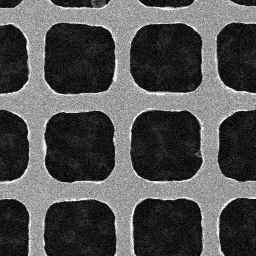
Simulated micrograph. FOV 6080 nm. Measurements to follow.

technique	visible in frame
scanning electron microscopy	holes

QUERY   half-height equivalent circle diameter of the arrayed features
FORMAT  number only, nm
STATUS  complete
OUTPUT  1810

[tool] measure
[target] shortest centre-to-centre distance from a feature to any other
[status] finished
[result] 2060 nm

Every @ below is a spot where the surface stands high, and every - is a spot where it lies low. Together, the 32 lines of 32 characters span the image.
--@@@@@------@@@@@------@@@@@@--
@@@@@@@@@@@@@@@@@@@@@@@@@@@@@@@@
@@@@@@@@@@@@@@@@@@@@@@@@@@@@@@@@
--@@@@-------@@@@@------@@@@----
---@@@--------@@@--------@@-----
---@@@--------@@---------@@-----
---@@@--------@@---------@@-----
----@@--------@@---------@@-----
----@@--------@@---------@@-----
----@@--------@@---------@@-----
---@@@--------@@@--------@@@----
--@@@@@------@@@@@@-----@@@@@@--
@@@@@@@@@@@@@@@@@@@@@@@@@@@@@@@@
@@@@@@@@@@@@@@@@@@@@@@@@@@@@@@@@
--@@@@@-------@@@-------@@@@@---
---@@@--------@@@--------@@@----
---@@@--------@@---------@@-----
---@@@--------@@---------@@-----
----@@--------@@---------@@-----
----@@--------@@---------@@-----
----@@--------@@---------@@-----
---@@@--------@@@--------@@@----
--@@@@@------@@@@@-----@@@@@@---
@@@@@@@@@@@@@@@@@@@@@@@@@@@@@@@@
@@@@@@@@@@@@@@@@@@@@@@@@@@@@@@@@
---@@@@------@@@@--------@@@@---
----@@--------@@@--------@@@----
----@@--------@@@--------@@-----
----@---------@@@--------@@-----
----@----------@@--------@@-----
----@@---------@@--------@@-----
----@@---------@@--------@@@----